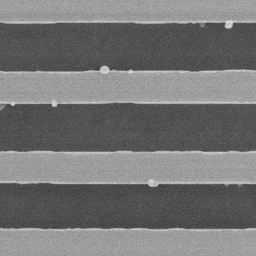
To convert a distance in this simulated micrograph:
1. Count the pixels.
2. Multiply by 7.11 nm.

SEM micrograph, lines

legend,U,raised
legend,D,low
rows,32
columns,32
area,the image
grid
UUUUUUUUUUUUUUUUUUUUUUUUUUUUUUUU
UUUUUUUUUUUUUUUUUUUUUUUUUUUUUUUU
UUUUUUUUUUUUUUUUUUUUUUUUUUUUUUUU
DDDDDDDDDDDDDDDDDDDDDDDDDDDDDDDD
DDDDDDDDDDDDDDDDDDDDDDDDDDDDDDDD
DDDDDDDDDDDDDDDDDDDDDDDDDDDDDDDD
DDDDDDDDDDDDDDDDDDDDDDDDDDDDDDDD
DDDDDDDDDDDDDDDDDDDDDDDDDDDDDDDD
DDDDDDDDDDDDDDDDDDDDDDDDDDDDDDDD
UUUUUUUUUUUUUUUUUUUUUUUUUUUUUUUU
UUUUUUUUUUUUUUUUUUUUUUUUUUUUUUUU
UUUUUUUUUUUUUUUUUUUUUUUUUUUUUUUU
UUUUUUUUUUUUUUUUUUUUUUUUUUUUUUUU
DDDDDDDDDDDDDDDDDDDDDDDDDDDDDDDD
DDDDDDDDDDDDDDDDDDDDDDDDDDDDDDDD
DDDDDDDDDDDDDDDDDDDDDDDDDDDDDDDD
DDDDDDDDDDDDDDDDDDDDDDDDDDDDDDDD
DDDDDDDDDDDDDDDDDDDDDDDDDDDDDDDD
DDDDDDDDDDDDDDDDDDDDDDDDDDDDDDDD
UUUUUUUUUUUUUUUUUUUUUUUUUUUUUUUU
UUUUUUUUUUUUUUUUUUUUUUUUUUUUUUUU
UUUUUUUUUUUUUUUUUUUUUUUUUUUUUUUU
UUUUUUUUUUUUUUUUUUUUUUUUUUUUUUUU
DDDDDDDDDDDDDDDDDDDDDDDDDDDDDDDD
DDDDDDDDDDDDDDDDDDDDDDDDDDDDDDDD
DDDDDDDDDDDDDDDDDDDDDDDDDDDDDDDD
DDDDDDDDDDDDDDDDDDDDDDDDDDDDDDDD
DDDDDDDDDDDDDDDDDDDDDDDDDDDDDDDD
DDDDDDDDDDDDDDDDDDDDDDDDDDDDDDDD
UUUUUUUUUUUUUUUUUUUUUUUUUUUUUUUU
UUUUUUUUUUUUUUUUUUUUUUUUUUUUUUUU
UUUUUUUUUUUUUUUUUUUUUUUUUUUUUUUU